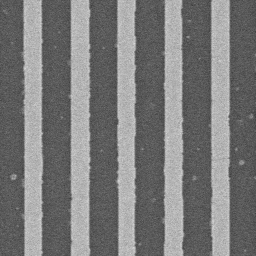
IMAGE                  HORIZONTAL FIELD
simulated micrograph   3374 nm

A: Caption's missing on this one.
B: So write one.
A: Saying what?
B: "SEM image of lines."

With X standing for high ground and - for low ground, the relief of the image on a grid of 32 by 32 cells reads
---XX----XX----XX----XX---XXX---
---XX----XX----XX----XX---XXX---
---XX----XX----XX----XX---XXX---
---XX----XX----XX----XX---XXX---
---XX----XX----XX----XX---XXX---
---XX----XX----XX----XX---XXX---
---XX----XX----XX----XX---XXX---
---XX----XX----XX----XX---XXX---
---XX----XX----XX----XX---XXX---
---XX----XX----XX----XX---XXX---
---XX----XX----XX----XX---XXX---
---XX----XX----XX----XX---XXX---
---XX----XX----XX----XX---XXX---
---XX----XX----XX----XX---XXX---
---XX----XX----XX----XX---XXX---
---XX----XX----XX----XX---XXX---
---XX----XX----XX----XX---XXX---
---XX----XX----XX----XX---XXX---
---XX----XX----XX----XX---XXX---
---XX----XX----XX----XX----XX---
---XX----XX----XX----XX---XXX---
---XX----XX----XX----XX---XX----
---XX----XX----XX----XX---XXX---
---XX----XX----XX----XX---XXX---
---XX----XX----XX----XX---XXX---
---XX----XX----XX----XX---XXX---
---XX----XX----XX----XX---XXX---
---XX----XX----XX----XX---XXX---
---XX----XX----XX----XX---XXX---
---XX----XX----XX----XX---XXX---
---XX----XX----XX----XX----XX---
---XX----XX----XX----XX----XX---